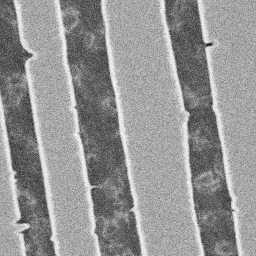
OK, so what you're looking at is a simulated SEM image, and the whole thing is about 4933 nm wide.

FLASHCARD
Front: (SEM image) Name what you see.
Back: one or a few lines or trenches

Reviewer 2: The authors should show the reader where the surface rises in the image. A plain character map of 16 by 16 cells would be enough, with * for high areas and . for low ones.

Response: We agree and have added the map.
.***..****...***
.***...***...***
.***...****..***
..**...****..***
..**...****..***
..**...****..***
..***..****..***
..***...****..**
..***...****..**
...**...****..**
*..**...****..**
*..**...****..**
*..***..****...*
*..***...***...*
*..***...***...*
*...**...****..*